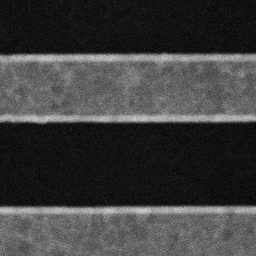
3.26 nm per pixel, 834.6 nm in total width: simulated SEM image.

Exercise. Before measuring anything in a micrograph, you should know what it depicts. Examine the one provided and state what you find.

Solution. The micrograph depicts one or a few lines or trenches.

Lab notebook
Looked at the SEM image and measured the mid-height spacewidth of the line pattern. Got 296 nm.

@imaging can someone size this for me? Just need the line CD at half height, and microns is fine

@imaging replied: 0.198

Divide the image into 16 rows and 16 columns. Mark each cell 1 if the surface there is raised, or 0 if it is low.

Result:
0000000000000000
0000000000000000
0000000000000000
0000000000000000
1111111111111111
1111111111111111
1111111111111111
0000000000000000
0000000000000000
0000000000000000
0000000000000000
0000000000000000
0000000000000000
1111111111111111
1111111111111111
1111111111111111